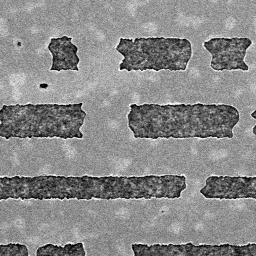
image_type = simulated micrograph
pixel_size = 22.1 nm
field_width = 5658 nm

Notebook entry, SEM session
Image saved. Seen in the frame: one or a few lines or trenches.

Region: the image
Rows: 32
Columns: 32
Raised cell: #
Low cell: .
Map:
################################
################################
################################
################################
################################
##.###...######.........##.....#
######....#####.........##.....#
#######...#####.........##.....#
######....#####........####....#
################################
#####.##########################
################################
################################
..........######.............###
...........#####..............##
..........######..............##
..........#######............###
################################
################################
################################
################################
################################
.......................###......
.......................##.......
......................####......
################################
################################
################################
################################
################################
#..######.#############.####.##.
....#......######...............